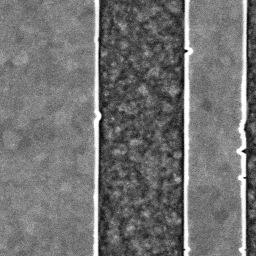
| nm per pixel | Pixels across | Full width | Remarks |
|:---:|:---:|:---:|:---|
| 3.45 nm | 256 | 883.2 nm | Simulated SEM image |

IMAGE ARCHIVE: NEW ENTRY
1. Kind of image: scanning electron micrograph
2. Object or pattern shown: one or a few lines or trenches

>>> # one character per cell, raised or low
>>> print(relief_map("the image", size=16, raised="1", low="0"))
1111110000001110
1111110000001110
1111110000001110
1111110000001110
1111110000001110
1111110000001110
1111110000001110
1111110000001110
1111110000001110
1111110000001110
1111110000001110
1111110000001110
1111110000001110
1111110000001110
1111110000001110
1111110000001110